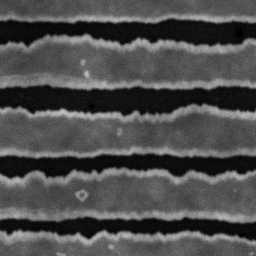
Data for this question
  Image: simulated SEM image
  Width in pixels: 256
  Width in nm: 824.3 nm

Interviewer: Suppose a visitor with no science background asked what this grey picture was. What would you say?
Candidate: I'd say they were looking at lines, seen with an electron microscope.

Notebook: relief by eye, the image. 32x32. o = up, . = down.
oooooooooooooooooooooooooooooooo
oooooooooooooooooooooooooooooooo
..oooooooo.ooooooooo......oooooo
................................
................................
.oo.ooooooooooo..oooooo.......oo
oooooooooooooooooooooooooooooooo
oooooooooooooooooooooooooooooooo
oooooooooooooooooooooooooooooooo
oooooooooooooooooooooooooooooooo
ooo....ooooooooooooooooooooooooo
................................
................................
.......................oooo.....
ooooooooooooooo.ooo.oooooooooooo
oooooooooooooooooooooooooooooooo
oooooooooooooooooooooooooooooooo
oooooooooooooooooooooooooooooooo
oooooooooooooooooooooooooooooooo
....o...........................
................................
.............oooo.ooo..........o
oooooooooooooooooooooooooooooooo
oooooooooooooooooooooooooooooooo
oooooooooooooooooooooooooooooooo
oooooooooooooooooooooooooooooooo
oooooooooooooooooooooooooooooooo
.............................ooo
................................
ooooooo..o..oooooo.o.ooooo.o....
oooooooooooooooooooooooooooooooo
oooooooooooooooooooooooooooooooo